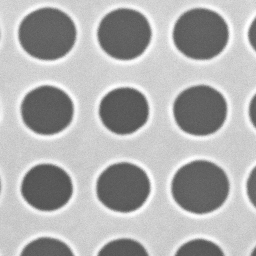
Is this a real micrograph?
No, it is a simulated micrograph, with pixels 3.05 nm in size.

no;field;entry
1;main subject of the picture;a regular array of holes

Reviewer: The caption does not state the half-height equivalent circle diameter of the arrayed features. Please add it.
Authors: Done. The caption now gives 164 nm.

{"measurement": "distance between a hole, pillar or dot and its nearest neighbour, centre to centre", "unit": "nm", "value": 233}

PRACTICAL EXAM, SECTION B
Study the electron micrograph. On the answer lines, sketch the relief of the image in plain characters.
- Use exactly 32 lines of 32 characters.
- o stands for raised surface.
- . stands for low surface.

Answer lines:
oooooooooooooooooooooooooooooooo
oooo....oooooo....ooooo....ooooo
ooo......oooo.....oooo......oooo
oo........oo.......ooo.......oo.
oo........oo.......oo........oo.
oo.......ooo.......ooo......ooo.
ooo......oooo.....oooo......oooo
ooooo..oooooooo.ooooooooo.oooooo
oooooooooooooooooooooooooooooooo
oooooooooooooooooooooooooooooooo
oooooooooooooooooooooooooooooooo
oooo....oooooo....ooooo....ooooo
ooo......oooo.....oooo......ooo.
ooo......ooo.......ooo......ooo.
ooo......ooo.......ooo......ooo.
ooo......oooo.....oooo......ooo.
oooo....oooooo...oooooo....ooooo
oooooooooooooooooooooooooooooooo
oooooooooooooooooooooooooooooooo
oooooooooooooooooooooooooooooooo
ooooo.oooooooo...oooooo....ooooo
ooo.....ooooo.....oooo......ooo.
ooo......ooo.......ooo.......oo.
ooo......ooo.......oo........oo.
ooo......ooo.......ooo.......oo.
oooo....ooooo.....oooo......ooo.
oooooooooooooo...oooooo....ooooo
oooooooooooooooooooooooooooooooo
oooooooooooooooooooooooooooooooo
oooooooooooooooooooooooooooooooo
ooo.....ooooo.....ooooo....ooooo
ooo......ooo......oooo......ooo.